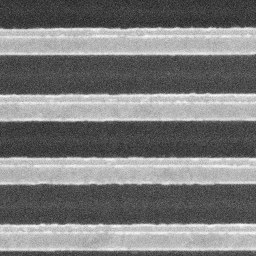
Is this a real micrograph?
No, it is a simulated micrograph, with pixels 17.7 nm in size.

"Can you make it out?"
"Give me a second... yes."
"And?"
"lines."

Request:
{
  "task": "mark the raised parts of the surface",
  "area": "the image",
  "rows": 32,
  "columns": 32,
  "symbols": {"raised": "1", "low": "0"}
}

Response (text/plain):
00000000000000000000000000000000
00000000000000000000000000000000
00000000000000000000000000000000
00000000000000000000000000000000
11111111111111111111111111111111
11111111111111111111111111111111
11111111111111111111111111111111
00000000000000000000000000000000
00000000000000000000000000000000
00000000000000000000000000000000
00000000000000000000000000000000
00000000000000000000000000000000
11111111111111111111111111111111
11111111111111111111111111111111
11111111111111111111111111111111
00000000000000000000000000000000
00000000000000000000000000000000
00000000000000000000000000000000
00000000000000000000000000000000
00000000000000000000000000000000
11111111111111111111111111111111
11111111111111111111111111111111
11111111111111111111111111111111
00000000000000000000000000000000
00000000000000000000000000000000
00000000000000000000000000000000
00000000000000000000000000000000
00000000000000000000000000000000
11111111111111111111111111111111
11111111111111111111111111111111
11111111111111111111111111111111
00000000000000000000000000000000